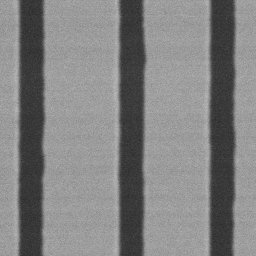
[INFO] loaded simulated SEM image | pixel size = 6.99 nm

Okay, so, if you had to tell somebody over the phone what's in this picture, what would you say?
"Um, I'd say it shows lines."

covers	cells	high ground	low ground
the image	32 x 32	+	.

++....+++++++++...++++++++...+++
++...++++++++++...++++++++...+++
++...++++++++++...++++++++...+++
++....+++++++++...++++++++...+++
++....+++++++++...++++++++...+++
++....+++++++++...++++++++...+++
++....+++++++++...++++++++...+++
++....+++++++++...++++++++...+++
++...++++++++++...++++++++...+++
++...++++++++++...++++++++...+++
++....+++++++++...++++++++...+++
++....+++++++++...++++++++...+++
++....+++++++++...++++++++...+++
++....+++++++++...++++++++...+++
++....+++++++++...++++++++...+++
++....+++++++++...++++++++...+++
++...++++++++++...++++++++...+++
++...++++++++++...++++++++...+++
++...++++++++++...++++++++...+++
++....+++++++++...++++++++...+++
++....+++++++++...++++++++...+++
++...++++++++++...++++++++...+++
++...++++++++++...++++++++...+++
++...++++++++++...++++++++...+++
++...++++++++++...++++++++...+++
++...++++++++++...++++++++...+++
++...++++++++++...++++++++...+++
++...++++++++++...++++++++...+++
++...++++++++++...++++++++...+++
++...++++++++++...++++++++...+++
++...++++++++++...++++++++...+++
++...++++++++++...++++++++...+++